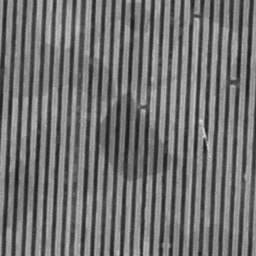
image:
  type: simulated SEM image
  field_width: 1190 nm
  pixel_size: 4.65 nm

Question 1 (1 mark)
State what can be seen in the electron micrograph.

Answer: parallel lines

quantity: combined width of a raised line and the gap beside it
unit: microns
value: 0.0458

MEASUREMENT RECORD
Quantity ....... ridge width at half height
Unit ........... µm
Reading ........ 0.0244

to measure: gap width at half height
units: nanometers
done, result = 20.9